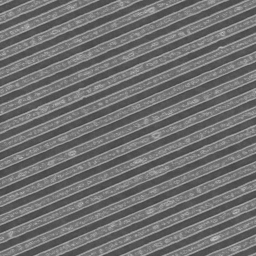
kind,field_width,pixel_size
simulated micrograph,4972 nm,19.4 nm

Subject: parallel lines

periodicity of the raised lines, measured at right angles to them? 328 nanometres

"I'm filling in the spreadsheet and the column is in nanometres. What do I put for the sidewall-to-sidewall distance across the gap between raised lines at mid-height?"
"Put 159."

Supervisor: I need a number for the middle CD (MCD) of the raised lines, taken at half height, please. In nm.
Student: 176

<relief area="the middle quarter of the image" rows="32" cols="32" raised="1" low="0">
11000001111110000011111000000111
00000111110000001111110000111111
00111111000001111110000011111100
11111100000111110000001111100000
11100000111111000001111110000011
10000011111100000111111000011111
00001111110000011111000001111110
01111110000011111100000111110000
11110000001111110000011111000001
11000000111110000001111100000111
00000111111000001111100000011111
00011111000000111110000011111100
11111100000011111000001111110000
11110000011111100000111110000001
10000001111110000111111000001111
00001111110000011111100000111111
00111110000001111100000011111000
11111000001111110000011111100000
11100000111111000001111110000111
10000011111000000111110000001111
00011111100000111111000001111100
01111110000011111100001111110000
11110000001111100000111111000001
11000001111110000011111000000111
00000111111000011111100000111111
00111111000001111110000111111100
11111100000111110000011111100000
11100000111111000001111110000011
10000011111100000111111000011111
00001111100000011111000001111110
01111110000011111100000111110000
11111000001111110000111111000001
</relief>